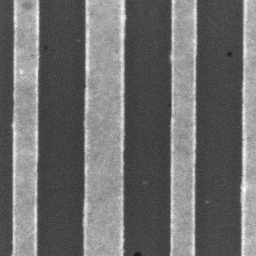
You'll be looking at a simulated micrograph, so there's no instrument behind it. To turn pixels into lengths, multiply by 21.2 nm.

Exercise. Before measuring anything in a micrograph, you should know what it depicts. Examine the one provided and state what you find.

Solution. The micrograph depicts lines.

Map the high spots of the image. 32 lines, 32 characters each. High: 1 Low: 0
00111000000111100000001110000001
00111000000111100000001110000001
00111000000111100000001110000001
00111000000111100000001110000001
00111000000111100000001110000001
00111000000111100000001100000011
00111000000111100000001100000011
00111000000111100000001100000011
00111000000111100000001100000011
00111000000111100000001100000011
00111000000111100000001100000011
00111000000111100000001100000011
00111000000111100000001100000011
00111000000111100000001100000011
00111000000111100000001100000011
00111000000111100000011100000011
00111000000111100000011100000011
00111000000111100000011100000011
00111000000111100000011100000011
00111000000111100000011100000011
00111000000111100000011100000011
00111000000111100000011100000011
00111000000111100000011100000011
00111000000111100000011100000011
00111000000111100000011100000011
00111000000111100000011100000011
00111000000111100000011100000011
00111000000111100000011100000011
00111000000111100000011100000011
00110000000111100000011100000011
00111000000111100000011100000011
00111000000111100000011100000011